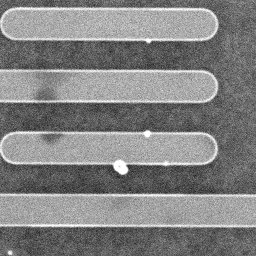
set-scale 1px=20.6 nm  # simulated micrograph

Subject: groups of lines, slits or small figures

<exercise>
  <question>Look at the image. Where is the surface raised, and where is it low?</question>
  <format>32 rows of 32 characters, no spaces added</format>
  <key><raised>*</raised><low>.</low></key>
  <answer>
................................
.*************************......
***************************.....
***************************.....
.*************************......
................................
................................
................................
................................
***************************.....
***************************.....
***************************.....
**************************......
................................
................................
................................
................................
***************************.....
***************************.....
***************************.....
..............**....*...........
...............*................
................................
................................
*******************************.
********************************
********************************
********************************
................................
................................
................................
................................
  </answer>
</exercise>